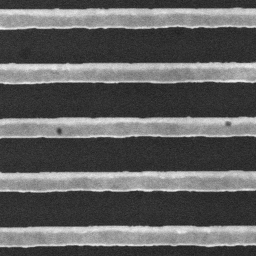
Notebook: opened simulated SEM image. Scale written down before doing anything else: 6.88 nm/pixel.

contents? lines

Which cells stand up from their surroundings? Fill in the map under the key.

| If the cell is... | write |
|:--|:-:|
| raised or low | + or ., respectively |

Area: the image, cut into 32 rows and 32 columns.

................................
++++++++++++++++++++++++++++++++
++++++++++++++++++++++++++++++++
+++++++++.++++.+++++............
................................
................................
................................
................................
++++++++++++++++++++++++++++++++
++++++++++++++++++++++++++++++++
................................
................................
................................
................................
................................
++++++++++++++++++++++++++++++++
++++++++++++++++++++++++++++++++
................................
................................
................................
................................
............................++..
++++++++++++++++++++++++++++++++
++++++++++++++++++++++++++++++++
................................
................................
................................
................................
...........+++++++..+++++.++++++
++++++++++++++++++++++++++++++++
++++++++++++++++++++++++++++++++
................................